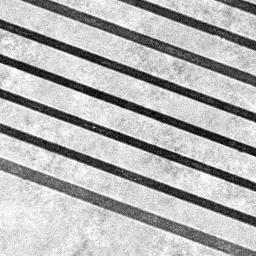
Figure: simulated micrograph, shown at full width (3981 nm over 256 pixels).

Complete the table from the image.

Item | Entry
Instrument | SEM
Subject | parallel lines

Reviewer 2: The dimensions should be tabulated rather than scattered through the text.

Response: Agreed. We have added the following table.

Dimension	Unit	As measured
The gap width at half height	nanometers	146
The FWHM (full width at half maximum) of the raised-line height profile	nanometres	372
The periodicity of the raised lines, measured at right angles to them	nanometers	510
